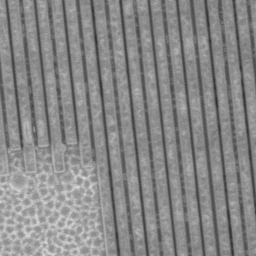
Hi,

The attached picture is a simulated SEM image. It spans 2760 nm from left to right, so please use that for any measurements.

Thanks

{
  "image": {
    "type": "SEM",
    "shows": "parallel lines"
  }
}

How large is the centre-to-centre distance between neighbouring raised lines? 152 nanometres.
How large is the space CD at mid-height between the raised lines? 0.0388 micrometres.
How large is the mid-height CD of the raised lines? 106 nanometers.